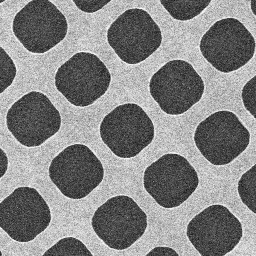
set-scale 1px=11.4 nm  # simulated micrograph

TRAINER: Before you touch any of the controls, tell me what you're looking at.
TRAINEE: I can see a regular array of holes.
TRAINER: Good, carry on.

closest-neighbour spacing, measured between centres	65.9	pixels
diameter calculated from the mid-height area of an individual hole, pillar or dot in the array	605	nm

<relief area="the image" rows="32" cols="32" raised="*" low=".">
***....**....*******......*****.
**......***.***...***....*******
**......******.....***..****..**
**......******......******.....*
**......*****.......*****.......
***....*******......*****.......
.***..********.....******.......
..*******....**...****.***.....*
..*****......*******....***...**
..*****.......*****......*******
.******.......*****......******.
****.**......******......*****..
**....**....*******......*****..
*......*******....**....*******.
*.......*****......*******...***
*.......*****......******.....**
*......*****.......*****.......*
**....*******......*****.......*
********...***....*******......*
.******.....***..***...**.....**
.*****.......******.....***.****
.*****.......*****.......******.
******.......*****.......*****..
**..***.....******.......*****..
*....***...***..***.....******..
......*******....***...********.
......******......*******....***
......*****.......******......**
......******......*****.......**
*....*******......*****.......**
*******...***....*******......**
******.....********...***....***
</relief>